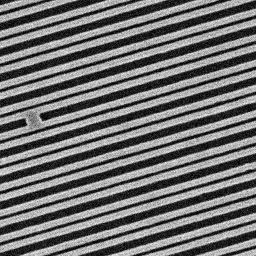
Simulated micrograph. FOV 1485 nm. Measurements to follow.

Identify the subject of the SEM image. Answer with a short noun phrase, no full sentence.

parallel lines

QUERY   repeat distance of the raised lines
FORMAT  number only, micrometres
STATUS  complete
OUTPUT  0.0711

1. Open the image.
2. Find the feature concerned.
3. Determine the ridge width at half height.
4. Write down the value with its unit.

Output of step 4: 32.1 nanometres